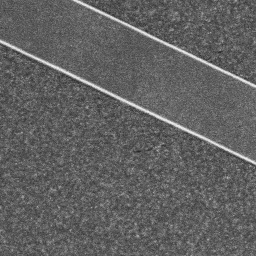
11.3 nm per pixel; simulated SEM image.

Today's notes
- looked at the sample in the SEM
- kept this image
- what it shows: one or a few lines or trenches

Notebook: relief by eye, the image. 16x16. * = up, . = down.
******..........
********........
**********......
..**********....
....**********..
......**********
........********
..........******
............****
..............**
................
................
................
................
................
................